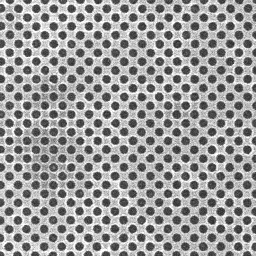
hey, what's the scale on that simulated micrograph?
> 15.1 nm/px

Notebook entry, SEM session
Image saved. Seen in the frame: a regular array of holes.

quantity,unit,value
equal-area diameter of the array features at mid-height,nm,141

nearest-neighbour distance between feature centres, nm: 185